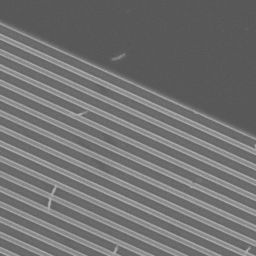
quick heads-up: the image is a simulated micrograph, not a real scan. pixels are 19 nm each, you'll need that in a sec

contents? parallel lines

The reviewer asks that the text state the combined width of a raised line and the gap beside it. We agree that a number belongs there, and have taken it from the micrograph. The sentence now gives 13.9 px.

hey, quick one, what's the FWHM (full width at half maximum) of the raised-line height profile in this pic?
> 82.4 nanometres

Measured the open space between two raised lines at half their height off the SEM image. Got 0.178 micrometres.